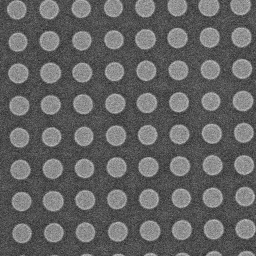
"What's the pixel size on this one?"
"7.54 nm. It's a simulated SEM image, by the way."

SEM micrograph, an array of small figures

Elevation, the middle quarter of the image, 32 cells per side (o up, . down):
...ooo.....ooo.....ooo.....oooo.
..ooooo...ooooo...ooooo...ooooo.
..ooooo...ooooo...ooooo...ooooo.
...oooo....ooo.....ooo.....ooo..
................................
................................
................................
............................oo..
...ooo.....oooo....oooo....oooo.
...oooo...ooooo...ooooo...ooooo.
...oooo....oooo...ooooo....oooo.
...oooo....oooo....ooo.....ooo..
................................
................................
................................
............................oo..
...oooo....oooo....oooo....oooo.
...oooo....oooo....oooo....oooo.
...oooo....oooo....oooo....oooo.
...oooo....oooo....ooo......oo..
................................
................................
................................
.....................o......oo..
....ooo....oooo....oooo....oooo.
...oooo....oooo....oooo....oooo.
...oooo....oooo....oooo....oooo.
...oooo.....ooo.....ooo.....oo..
................................
................................
................................
....................oo......oo..